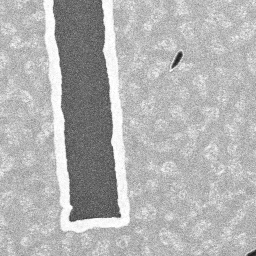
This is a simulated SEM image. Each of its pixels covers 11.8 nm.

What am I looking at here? one or a few lines or trenches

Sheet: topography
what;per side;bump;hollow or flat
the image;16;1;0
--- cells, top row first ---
1110000111111111
1110000111111111
1110000111111111
1110000111111111
1110000111111111
1111000111111111
1111000111111111
1111000111111111
1111000111111111
1111000111111111
1111000111111111
1111000011111111
1111000011111111
1111000011111111
1111111111111111
1111111111111111